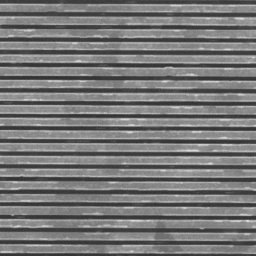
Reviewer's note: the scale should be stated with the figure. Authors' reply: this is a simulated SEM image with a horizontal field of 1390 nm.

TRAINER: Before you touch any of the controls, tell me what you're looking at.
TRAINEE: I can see parallel lines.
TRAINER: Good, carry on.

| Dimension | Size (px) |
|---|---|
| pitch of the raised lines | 12.7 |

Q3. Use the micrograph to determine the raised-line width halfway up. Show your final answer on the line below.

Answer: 42.8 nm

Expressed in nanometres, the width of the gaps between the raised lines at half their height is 23.8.